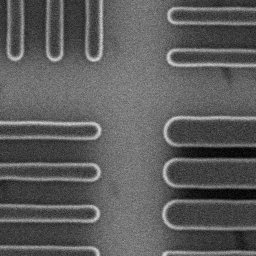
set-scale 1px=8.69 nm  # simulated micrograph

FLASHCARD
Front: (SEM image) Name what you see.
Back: groups of lines, slits or small figures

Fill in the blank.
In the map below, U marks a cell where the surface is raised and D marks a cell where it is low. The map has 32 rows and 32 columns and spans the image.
DUUDDDUUDDDUUDDDDDDDDDDDDDDDDDDD
DUUDDDUUDDDUUDDDDDDDDUUUUUUUUUUU
DUUDDDUUDDDUUDDDDDDDDUUUUUUUUUUU
DUUDDDUUDDDUUDDDDDDDDDDDDDDDDDDD
DUUDDDUUDDDUUDDDDDDDDDDDDDDDDDDD
DUUDDDUUDDDUUDDDDDDDDDDDDDDDDDDD
DUUDDDUUDDDUUDDDDDDDDUUUUUUUUUUU
DDDDDDDDDDDUDDDDDDDDDUUUUUUUUUUU
DDDDDDDDDDDDDDDDDDDDDDDDDDDDDDDD
DDDDDDDDDDDDDDDDDDDDDDDDDDDDDDDD
DDDDDDDDDDDDDDDDDDDDDDDDDDDDDDDD
DDDDDDDDDDDDDDDDDDDDDDDDDDDDDDDD
DDDDDDDDDDDDDDDDDDDDDDDDDDDDDDDD
DDDDDDDDDDDDDDDDDDDDDDDDDDDDDDDD
DDDDDDDDDDDDDDDDDDDDDDDDDDDDDDDD
UUUUUUUUUUUUDDDDDDDDDUUUUUUUUUUU
UUUUUUUUUUUUDDDDDDDDDUUUUUUUUUUU
DDDDDDDDDDDDDDDDDDDDDUUUUUUUUUUU
DDDDDDDDDDDDDDDDDDDDDDDDDDDDDDDD
DDDDDDDDDDDDDDDDDDDDDDDDDDDDDDDD
DDDUUUDDDDDDDDDDDDDDDUUUUUUUUUUU
UUUUUUUUUUUUDDDDDDDDDUUUUUUUUUUU
DDDUUUUUUUUUDDDDDDDDDUUUUUUUUUUU
DDDDDDDDDDDDDDDDDDDDDDDDDDDDDDDD
DDDDDDDDDDDDDDDDDDDDDDDDDDDDDDDD
DDDDDDDDDDDDDDDDDDDDDUUUUUUUUUUU
UUUUUUUUUUUUDDDDDDDDUUUUUUUUUUUU
UUUUUUUUUUUUDDDDDDDDDUUUUUUUUUUU
DDDDDDDDDDDDDDDDDDDDDDUUUUUUUUUU
DDDDDDDDDDDDDDDDDDDDDDDDDDDDDDDD
DDDDDDDDDDDDDDDDDDDDDDDDDDDDDDDD
UUUUUUUUUUUUDDDDDDDDDUUUDDDUUUUU